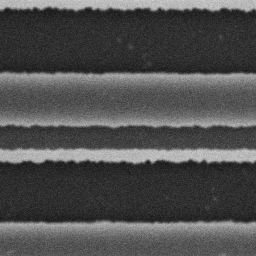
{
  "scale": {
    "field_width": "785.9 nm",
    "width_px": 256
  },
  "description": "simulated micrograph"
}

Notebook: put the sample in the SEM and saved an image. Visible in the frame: lines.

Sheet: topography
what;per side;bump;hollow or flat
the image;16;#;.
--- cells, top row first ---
##..#.##########
................
................
................
................
################
################
################
################
################
................
................
................
................
################
################